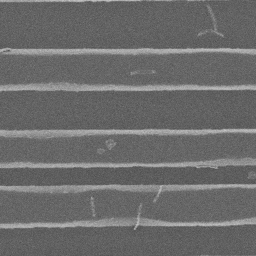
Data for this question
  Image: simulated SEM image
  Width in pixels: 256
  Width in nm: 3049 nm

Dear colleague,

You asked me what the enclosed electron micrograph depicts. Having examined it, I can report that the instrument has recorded lines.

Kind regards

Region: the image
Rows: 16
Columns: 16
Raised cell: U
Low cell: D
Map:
DDDDDDDDDDDDDDDD
DDDDDDDDDDDDDDDD
DDDDDDDDDDDDDDDD
UUUUUUUUUUUUUUUU
UUUUUUUUUUUUUUUU
UDDDDUUUUUDDUUUD
DDDDDDDDDDDDDDDD
DDDDDDDDDDDDDDDD
UUUUUUUUUUUUUUUU
UUUUUUUUUUUUUUUU
DDDDDDDDDDDDDDDD
DDDDDDDDDDDDDDDD
UUUUUUUUUUUUUUUU
UUUUUUUUUUUUUUUU
DDDDDDDDDDDDDDDD
DDDDDDDDDDDDDDDD